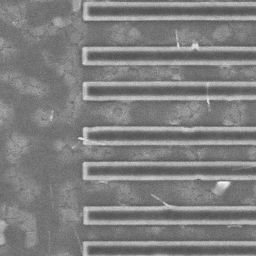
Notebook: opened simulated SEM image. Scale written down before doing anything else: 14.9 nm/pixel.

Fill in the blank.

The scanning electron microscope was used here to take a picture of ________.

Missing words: parallel lines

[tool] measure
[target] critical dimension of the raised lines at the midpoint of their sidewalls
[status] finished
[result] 228 nm